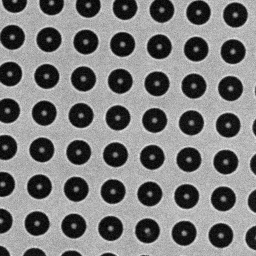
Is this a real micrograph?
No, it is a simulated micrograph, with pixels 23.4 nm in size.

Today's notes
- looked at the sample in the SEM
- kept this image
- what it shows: an array of small figures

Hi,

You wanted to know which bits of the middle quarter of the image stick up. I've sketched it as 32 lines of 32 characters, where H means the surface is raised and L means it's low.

HHHHLLHHHHHHHHHHHHHHHHHHHHHHHHHH
HHLLLLLHHHHHLLLLHHHHHHHHHHHHHHHH
HHLLLLLLHHHLLLLLLHHHHLLLLHHHHHHL
HHLLLLLLHHHLLLLLLHHHLLLLLLHHHHLL
HHLLLLLLHHHLLLLLLHHHLLLLLLHHHLLL
HHLLLLLLHHHLLLLLLHHHLLLLLLLHHLLL
HHHLLLLHHHHHLLLLHHHHLLLLLLHHHLLL
HHHHHHHHHHHHHHLHHHHHHLLLLHHHHHLL
HHHHHHHHHHHHHHHHHHHHHHHHHHHHHHHL
HHHHHHHHHHHHHHHHHHHHHHHHHHHHHHHH
HHLLLLHHHHHHLLLHHHHHHHHHHHHHHHHH
HLLLLLLHHHHLLLLLHHHHHLLLLHHHHHHL
HLLLLLLHHHLLLLLLLHHHLLLLLHHHHLLL
HLLLLLLHHHLLLLLLLHHLLLLLLLHHHLLL
HLLLLLLHHHLLLLLLLHHLLLLLLLHHHLLL
HHLLLLHHHHHLLLLLHHHHLLLLLLHHHLLL
HHHHHHHHHHHHLLLHHHHHHLLLLHHHHLLL
HHHHHHHHHHHHHHHHHHHHHHHHHHHHHHLL
HHHHHHHHHHHHHHHHHHHHHHHHHHHHHHHH
HHLLLLHHHHHHLLHHHHHHHHHHHHHHHHHH
HLLLLLHHHHLLLLLHHHHHHLLLHHHHHHHH
LLLLLLLHHHLLLLLLHHHLLLLLLHHHHLLL
LLLLLLLHHHLLLLLLHHHLLLLLLHHHLLLL
HLLLLLLHHHLLLLLLHHHLLLLLLHHHLLLL
HHLLLLHHHHLLLLLLHHHLLLLLLHHHLLLL
HHHHHHHHHHHLLLHHHHHHLLLLHHHHLLLL
HHHHHHHHHHHHHHHHHHHHHHLHHHHHHLLL
HHHHHHHHHHHHHHHHHHHHHHHHHHHHHHHH
HLLLLHHHHHHHHHHHHHHHHHHHHHHHHHHH
LLLLLLHHHHLLLLLHHHHHLLLHHHHHHHHH
LLLLLLHHHLLLLLLHHHHLLLLLHHHHHLLL
LLLLLLHHHLLLLLLHHHLLLLLLLHHHLLLL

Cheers